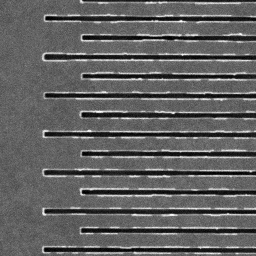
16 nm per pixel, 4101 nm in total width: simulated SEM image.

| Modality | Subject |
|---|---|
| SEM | parallel lines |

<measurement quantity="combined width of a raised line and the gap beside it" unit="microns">0.309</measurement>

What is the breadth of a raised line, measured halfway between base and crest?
228 nm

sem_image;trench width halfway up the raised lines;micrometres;0.0801